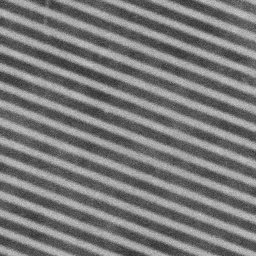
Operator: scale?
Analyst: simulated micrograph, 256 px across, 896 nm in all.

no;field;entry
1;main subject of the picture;parallel lines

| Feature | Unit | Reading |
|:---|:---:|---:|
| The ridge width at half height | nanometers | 22.9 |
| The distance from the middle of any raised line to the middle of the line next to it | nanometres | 59.6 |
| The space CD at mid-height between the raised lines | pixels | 11.1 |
